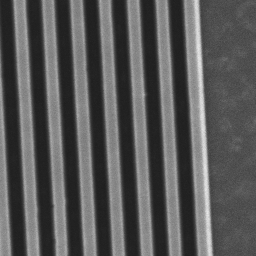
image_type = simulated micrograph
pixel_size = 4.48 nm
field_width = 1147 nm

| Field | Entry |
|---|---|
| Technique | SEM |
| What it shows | parallel lines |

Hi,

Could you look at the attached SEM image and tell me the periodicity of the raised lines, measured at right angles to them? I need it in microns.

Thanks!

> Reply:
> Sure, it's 0.127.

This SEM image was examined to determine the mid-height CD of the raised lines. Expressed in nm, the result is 59.8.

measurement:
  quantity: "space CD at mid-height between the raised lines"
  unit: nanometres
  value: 67.1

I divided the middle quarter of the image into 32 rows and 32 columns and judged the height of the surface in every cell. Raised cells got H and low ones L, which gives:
LLHHHHLLLHHHHLLLLHHHLLLLHHHLLLLH
LLHHHHLLLHHHHLLLLHHHLLLLHHHLLLLH
LLHHHHLLLLHHHLLLLHHHLLLLHHHLLLLH
LLLHHHLLLLHHHLLLLHHHLLLLHHHLLLLH
LLLHHHLLLLHHHLLLLHHHLLLLHHHLLLLH
LLLHHHLLLLHHHLLLLHHHLLLLHHHLLLLH
LLLHHHLLLLHHHLLLLHHHLLLLHHHLLLLH
LLLHHHLLLLHHHLLLLHHHLLLLHHHLLLLH
LLLHHHLLLLHHHLLLLHHHLLLLHHHLLLLH
LLLHHHLLLLHHHLLLLHHHLLLLHHHLLLLH
LLLHHHLLLLHHHLLLLHHHLLLLHHHLLLLH
LLLHHHLLLLHHHLLLLHHHLLLLHHHHLLLH
LLLHHHLLLLHHHLLLLHHHLLLLHHHHLLLL
LLLHHHLLLLHHHLLLLHHHHLLLLHHHLLLL
LLLHHHLLLLHHHHLLLHHHHLLLLHHHLLLL
LLLHHHHLLLHHHHLLLHHHHLLLLHHHLLLL
LLLHHHHLLLHHHHLLLHHHHLLLLHHHLLLL
LLLHHHHLLLHHHHLLLHHHHLLLLHHHLLLL
LLLHHHHLLLHHHHLLLHHHHLLLLHHHLLLL
LLLHHHHLLLHHHHLLLLHHHLLLLHHHLLLL
LLLHHHHLLLLHHHLLLLHHHLLLLHHHLLLL
LLLHHHHLLLLHHHLLLLHHHLLLLHHHLLLL
LLLLHHHLLLLHHHLLLLHHHLLLLHHHLLLL
LLLLHHHLLLLHHHLLLLHHHLLLLHHHLLLL
LLLLHHHLLLLHHHLLLLHHHLLLLHHHLLLL
LLLLHHHLLLLHHHLLLLHHHLLLLHHHLLLL
LLLLHHHLLLLHHHLLLLHHHLLLLHHHLLLL
LLLLHHHLLLLHHHLLLLHHHLLLLHHHLLLL
LLLLHHHLLLLHHHLLLLHHHLLLLHHHLLLL
LLLLHHHLLLLHHHLLLLHHHLLLLHHHLLLL
LLLLHHHLLLLHHHLLLLHHHLLLLHHHHLLL
LLLLHHHLLLLHHHLLLLHHHHLLLHHHHLLL